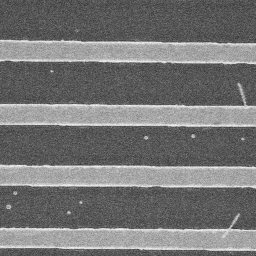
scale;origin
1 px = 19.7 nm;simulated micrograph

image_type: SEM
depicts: lines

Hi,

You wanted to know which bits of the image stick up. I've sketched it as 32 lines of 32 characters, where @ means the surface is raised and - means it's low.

--------------------------------
--------------------------------
--------------------------------
--------------------------------
--------------------------------
@@@@@@@@@@@@@@@@@@@@@@@@@@@-----
@@@@@@@@@@@@@@@@@@@@@@@@@@@@@@@@
-@@-@@@@@@@@@@@@@@@@@@@@@@@@@@@@
--------------------------------
--------------------------------
--------------------------------
--------------------------------
--------------------------------
@@@@@@@@@@@@@@@@@@@@@@@@@@@@@@@@
@@@@@@@@@@@@@@@@@@@@@@@@@@@@@@@@
@@@@@@@@@@@@@@@@@@@@@@@@@@@@@@@@
--------------------------------
--------------------------------
--------------------------------
--------------------------------
--------------------------------
@@@@@@@@@@@@@@@@@@@@@@@@@@@@@@@@
@@@@@@@@@@@@@@@@@@@@@@@@@@@@@@@@
--------------------------------
--------------------------------
--------------------------------
--------------------------------
--------------------------------
--------------------------------
@@@@@@@@@@@@@@@@@@@@@@@@@@@@@@@@
@@@@@@@@@@@@@@@@@@@@@@@@@@@@@@@@
--------------------------------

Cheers